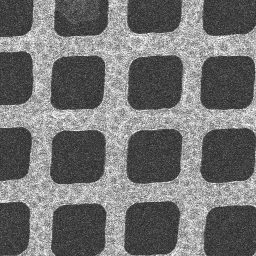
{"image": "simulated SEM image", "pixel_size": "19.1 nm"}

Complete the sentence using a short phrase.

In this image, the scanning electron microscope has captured holes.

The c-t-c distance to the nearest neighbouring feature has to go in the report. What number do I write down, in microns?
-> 1.41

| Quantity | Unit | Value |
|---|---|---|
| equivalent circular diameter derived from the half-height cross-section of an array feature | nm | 1130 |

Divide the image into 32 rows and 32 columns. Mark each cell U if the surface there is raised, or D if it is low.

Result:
DDDDUUUDDDDDDDUUDDDDDDDUUDDDDDDD
DDDDUUUDDDDDDDUUDDDDDDDUUDDDDDDD
DDDDUUUDDDDDDDUUDDDDDDDUUDDDDDDD
DDDDUUUDDDDDDUUUDDDDDDUUUDDDDDDD
DDDUUUUDDDDUUUUUUUUUUUUUUUDDUUUU
UUUUUUUUUUUUUUUUUUUUUUUUUUUUUUUU
DDDUUUUUUUUUUUUUUUUUUUUUUUUUUUUU
DDDDUUUDDDDDDUUUUDDDDDDUUUDDDDDU
DDDDUUDDDDDDDUUUDDDDDDDUUDDDDDDD
DDDDUUDDDDDDDUUUDDDDDDDUUDDDDDDD
DDDDUUDDDDDDDUUUDDDDDDDUUDDDDDDD
DDDDUUDDDDDDDUUUDDDDDDDUUDDDDDDD
DDDDUUDDDDDDDUUUDDDDDDUUUDDDDDDD
UUUUUUUDDDDDUUUUUDDDDUUUUUDDDDDU
UUUUUUUUUUUUUUUUUUUUUUUUUUUUUUUU
UUUUUUUUUUUUUUUUUUUUUUUUUUUUUUUU
DDDDUUUDDDDDUUUUUDDDDDUUUUDDDDDD
DDDDUUUDDDDDDUUUDDDDDDDUUDDDDDDD
DDDDUUDDDDDDDUUUDDDDDDDUUDDDDDDD
DDDDUUDDDDDDDUUUDDDDDDDUUDDDDDDD
DDDDUUDDDDDDDUUUDDDDDDDUUDDDDDDD
DDDUUUDDDDDDDUUUDDDDDDDUUDDDDDDD
DUUUUUUDDDDDUUUUDDDDDDUUUUDDDDDU
UUUUUUUUUUUUUUUUUUUUUUUUUUUUUUUU
UUUUUUUUUUUUUUUUUUUUUUUUUUUUUUUU
DDDUUUUUUDDDDUUUUDDDDDUUUUUUUUUU
DDDDUUUDDDDDDUUUDDDDDDDUUUDDDDDD
DDDDUUUDDDDDDUUUDDDDDDDUUUDDDDDD
DDDDUUUDDDDDDUUDDDDDDDUUUUDDDDDD
DDDDUUUDDDDDDUUDDDDDDDUUUDDDDDDD
DDDDUUDDDDDDDUUDDDDDDDUUUDDDDDDD
DDDUUUUDDDDDDUUUDDDDDUUUUUDDDDDD